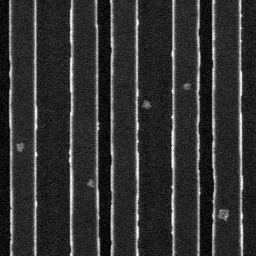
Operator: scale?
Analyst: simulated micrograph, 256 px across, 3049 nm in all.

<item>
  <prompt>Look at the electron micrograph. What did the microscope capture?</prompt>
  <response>lines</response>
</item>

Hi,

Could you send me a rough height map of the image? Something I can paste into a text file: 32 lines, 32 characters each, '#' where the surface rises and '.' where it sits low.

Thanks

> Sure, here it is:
.###.....###..###.....###..###..
.###.....###..###.....###..###..
.###.....###..###.....###..###..
.###.....###..###.....###..###..
.###.....###..###.....###..###..
.###.....###..###.....###..###..
.###.....###..###.....###..###..
.###.....###..###.....###..###..
.###.....###..###.....###..###..
.###.....###..###.....###..###..
.###.....###..###.....###..###..
.###.....###..###.....###..###..
.###.....###..###.....###..###..
.####....###..###.....###..###..
.####....###..###.....###..###..
.###.....###..###.....###..###..
.###.....###..###.....###..###..
.###.....###..###.....###..###..
.###.....###..###.....###..###..
.###.....###..###.....###..###..
.###.....###..###.....###..###..
.###.....###..###.....###..###..
.###.....###..###.....###..###..
.###.....###..###.....###..###..
.###.....###..###.....###..###..
.####....###..###.....###..###..
.###.....###..###.....###..###..
.###.....###..###.....###..###..
.###.....###..###.....###..###..
.###.....###..###.....###..###..
.###.....###..###.....###..###..
.###.....###..###.....###..###..